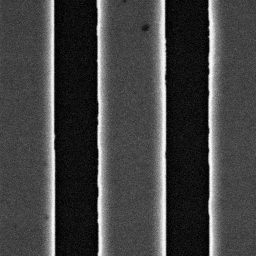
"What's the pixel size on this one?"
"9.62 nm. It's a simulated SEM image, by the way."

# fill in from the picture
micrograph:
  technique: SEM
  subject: lines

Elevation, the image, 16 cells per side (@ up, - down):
@@@---@@@@---@@@
@@@---@@@@---@@@
@@@---@@@@---@@@
@@@---@@@@---@@@
@@@---@@@@---@@@
@@@---@@@@---@@@
@@@---@@@@---@@@
@@@---@@@@---@@@
@@@---@@@@---@@@
@@@---@@@@---@@@
@@@---@@@@---@@@
@@@---@@@@---@@@
@@@---@@@@---@@@
@@@---@@@@---@@@
@@@---@@@@---@@@
@@@---@@@@---@@@